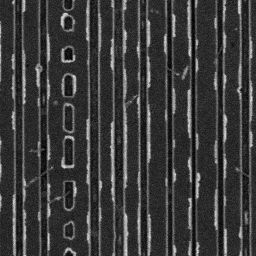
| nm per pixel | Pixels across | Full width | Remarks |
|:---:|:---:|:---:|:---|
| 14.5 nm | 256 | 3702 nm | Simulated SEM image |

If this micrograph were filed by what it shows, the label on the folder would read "parallel lines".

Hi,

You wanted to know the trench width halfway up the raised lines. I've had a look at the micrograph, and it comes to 0.108 microns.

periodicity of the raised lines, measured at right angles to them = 363 nanometres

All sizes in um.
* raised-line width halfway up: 0.257